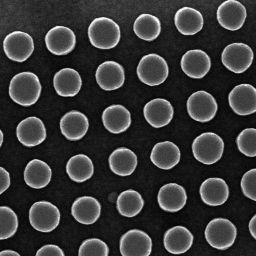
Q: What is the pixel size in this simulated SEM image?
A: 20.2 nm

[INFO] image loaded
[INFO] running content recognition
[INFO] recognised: a regular array of raised bodies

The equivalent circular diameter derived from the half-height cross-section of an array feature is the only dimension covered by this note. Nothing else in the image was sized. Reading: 0.58 microns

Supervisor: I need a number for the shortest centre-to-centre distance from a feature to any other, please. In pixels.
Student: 42.4